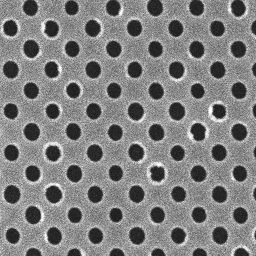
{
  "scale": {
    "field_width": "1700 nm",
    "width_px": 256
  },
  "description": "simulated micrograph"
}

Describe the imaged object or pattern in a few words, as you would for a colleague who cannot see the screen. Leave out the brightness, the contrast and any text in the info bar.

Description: a regular array of holes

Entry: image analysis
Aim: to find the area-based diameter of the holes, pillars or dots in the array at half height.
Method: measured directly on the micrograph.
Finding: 16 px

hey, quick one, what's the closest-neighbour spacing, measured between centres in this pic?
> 192 nanometres